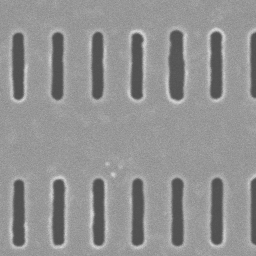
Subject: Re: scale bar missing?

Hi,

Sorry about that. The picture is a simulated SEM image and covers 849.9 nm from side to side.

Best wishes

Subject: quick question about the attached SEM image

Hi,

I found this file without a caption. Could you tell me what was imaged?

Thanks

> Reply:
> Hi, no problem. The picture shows a regular array of holes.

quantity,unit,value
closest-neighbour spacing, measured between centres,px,39.5